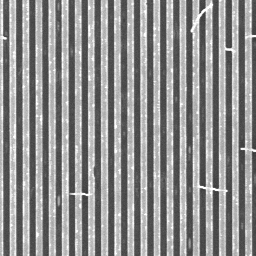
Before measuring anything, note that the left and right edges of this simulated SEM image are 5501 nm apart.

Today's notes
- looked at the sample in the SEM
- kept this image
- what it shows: parallel lines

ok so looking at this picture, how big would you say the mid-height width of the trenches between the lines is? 145 nm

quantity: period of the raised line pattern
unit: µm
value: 0.281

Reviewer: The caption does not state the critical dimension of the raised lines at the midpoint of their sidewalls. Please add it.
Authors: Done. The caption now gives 124 nanometers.